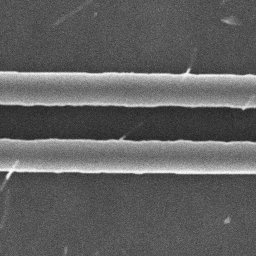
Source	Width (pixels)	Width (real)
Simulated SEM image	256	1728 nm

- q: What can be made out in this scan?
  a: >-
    lines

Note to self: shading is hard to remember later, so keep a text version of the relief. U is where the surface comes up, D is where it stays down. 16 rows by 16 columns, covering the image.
DDDDDDDDDDDDDDDD
DDDDDDDDDDDDDDDD
DDDDDDDDDDDDDDDD
DDDDDDDDDDDDDDDD
DDDDDDDDDDDDDDDD
UUUUUUUUUUUUUUUU
UUUUUUUUUUUUUUUU
DDDDDDDDDDDDDDDD
DDDDDDDDDDDDDDDD
UUUUUUUUUUUUUUUU
UUUUUUUUUUUUUUUU
DDDDDDDDDDDDDDDD
DDDDDDDDDDDDDDDD
DDDDDDDDDDDDDDDD
DDDDDDDDDDDDDDDD
DDDDDDDDDDDDDDDD